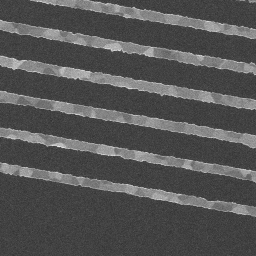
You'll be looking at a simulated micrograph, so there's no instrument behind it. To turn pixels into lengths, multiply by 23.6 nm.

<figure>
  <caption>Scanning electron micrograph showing parallel lines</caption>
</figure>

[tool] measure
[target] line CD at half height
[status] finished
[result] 221 nm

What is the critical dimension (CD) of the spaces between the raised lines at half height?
25.5 pixels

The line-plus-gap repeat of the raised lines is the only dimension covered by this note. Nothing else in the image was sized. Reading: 828 nanometres